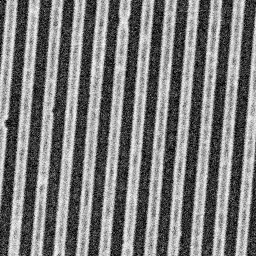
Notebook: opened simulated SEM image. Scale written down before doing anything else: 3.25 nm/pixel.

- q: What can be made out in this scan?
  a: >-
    parallel lines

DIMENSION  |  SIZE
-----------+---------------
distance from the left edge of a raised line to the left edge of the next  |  73.7 nm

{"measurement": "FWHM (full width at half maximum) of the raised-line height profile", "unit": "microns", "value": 0.032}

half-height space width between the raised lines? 40.5 nm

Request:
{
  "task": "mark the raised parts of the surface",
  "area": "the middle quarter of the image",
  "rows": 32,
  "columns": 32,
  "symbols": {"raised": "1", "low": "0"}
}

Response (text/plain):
00110001110001100011100010100011
01110001110001100011100011100011
01110001110001100011100011000011
01110001110001100011100011000011
01100001110001100011100011000011
01100001100001100011100011000011
01100001100011100011100011000111
01100001100011100011000011000111
01100001100011100011000111000111
01100011100011000011000111000110
01100011100011000011000111000110
00100011100011000011000111000110
00100011100011000001000111000110
11100011100011000101000111000110
11100011000011000111000110000110
11100011000011000111000110000110
11000011000011000111000110000110
11000011000011000111000110000110
11000011000111000111000110001110
11000011000111000110000110001110
11000111000111000110001110001110
11000111000110000110001110001100
11000111000110000110001110001100
11000111000110000110001110001100
11000111000110000110001110001100
11000111000110001110001110001100
11000110000000001110001100001100
11000110000000001110001100001100
10000110000110001110001100001100
10000110000110001110001100001100
10000110001110001100001100011100
10000110001110001100001100011100